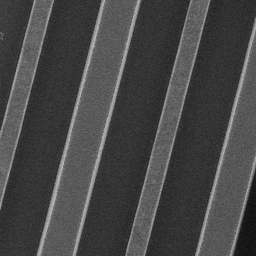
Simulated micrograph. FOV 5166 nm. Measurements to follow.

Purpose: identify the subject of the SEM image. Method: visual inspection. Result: lines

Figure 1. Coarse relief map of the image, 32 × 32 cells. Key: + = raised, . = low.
....+++......++++.......++......
....++......+++++......+++......
....++......+++++......+++......
...+++......+++++......++.......
...+++......++++.......++......+
...++......+++++......+++......+
...++......+++++......+++......+
..+++......+++++......++.......+
..+++......++++.......++......++
..++......+++++......+++......++
..++......+++++......+++......++
.+++......+++++......++.......++
.+++......++++.......++......+++
.++......+++++......+++......+++
.++......+++++......+++......+++
+++......++++.......++.......+++
+++......++++.......++......++++
++......+++++......+++......++++
++......+++++......+++......++++
++......++++.......++.......++++
++......++++.......++......+++++
+......+++++......+++......+++++
+......+++++......+++......++++.
+......++++.......++.......++++.
.......++++.......++......+++++.
......+++++......+++......+++++.
......+++++......++.......++++..
......++++.......++.......++++..
......++++.......++......+++++..
.....+++++......+++......+++++..
.....+++++......++.......++++...
.....++++.......++.......++++...